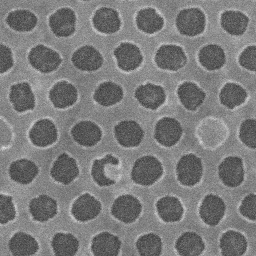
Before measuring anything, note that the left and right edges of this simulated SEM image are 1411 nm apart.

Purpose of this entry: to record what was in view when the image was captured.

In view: a regular array of holes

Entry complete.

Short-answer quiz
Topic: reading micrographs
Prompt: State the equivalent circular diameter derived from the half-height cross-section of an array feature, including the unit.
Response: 162 nm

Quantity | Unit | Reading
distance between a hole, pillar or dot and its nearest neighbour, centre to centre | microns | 0.226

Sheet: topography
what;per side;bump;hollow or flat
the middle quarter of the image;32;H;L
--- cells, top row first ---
HHHLLLLLLHHHHLLLLLLHHHHLLLLLLLHH
HHHHLLLLHHHHHHLLLLHHHHHHHLLLLHHH
HHHHHHHHHHHHHHHHHHHHHHHHHHHHHHHH
HHHHHHHHHHHHHHHHHHHHHHHHHHHHHHHH
LHHHHHHHHHLLHHHHHHHHHHHHHHHHHHLL
LLLHHHHHLLLLLLHHHHHLLLLLHHHHHLLL
LLLHHHHHLLLLLLLHHHLLLLLLLHHHLLLL
LLLLHHHLLLLLLLLHHHLLLLLLLLHHLLLL
LLLLHHHLLLLLLLLHHHLLLLLLLLHHHLLL
LLLHHHHHLLLLLLHHHHHLLLLLLHHHHLLL
LLHHHHHHHLLLHHHHHHHLLLLLHHHHHHLL
HHHHHHHHHHHHHHHHHHHHHHLHHHHHHHHL
HHHHHHHHHHHHHHHHHHHHHHHHHHHHHHHH
HHHHHHHHHHHHHHHHHHHHHHHHLLLLHHHH
HHHLLLLLHHHHHHLLLLHHHHHLLLLLLHHH
HHLLLLLLLHHHHLLLLLLHHHHLLLLLLHHH
HHLLLLLLLHHHLLLLLLLLHHHLLLLLLLHH
HHLLLLLLLLHHLLLLLLLLHHLLLLLLLLHH
HHLLLLLLLHHHHLLLLLLLHHHLLLLLLHHH
HHHLLLLLLHHHHLLLLLLHHHHLLLLLLHHH
HHHHLLLLHHHHHHLLLLLHHHHHLLLLHHHH
HHHHHHHHHHHHHHHHHHHHHHHHHHHHHHHH
LHHHHHHHHHHLHHHHHHHHHHHHHHHHHHHL
LLHHHHHHLLLLLHHHHHHLLLLHHHHHHLLL
LLLHHHHLLLLLLLHHHHLLLLLLHHHHLLLL
LLLLHHHLLLLHLLHHHLLLLLLLLHHHLLLL
LLLLHHHLLLHHHHHHHLLLLLLLLHHHLLLL
LLLLHHHLLLLHHHHHLLLLLLLLLHHHLLLL
LLLHHHHLLLLLHHHHHLLLLLLLHHHHLLLL
LLHHHHHHLLLLLHHHHLLLLLLHHHHHHLLL
HHHHHHHHLLLLHHHHHHHHLLHHHHHHHHLL
HHHHHHHHHHHHHHHHHHHHHHHHHHHHHHHH